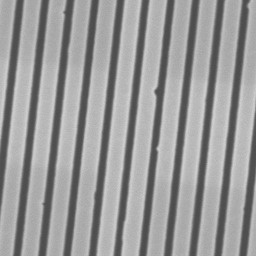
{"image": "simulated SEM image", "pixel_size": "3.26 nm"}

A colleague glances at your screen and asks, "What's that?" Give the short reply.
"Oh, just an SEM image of parallel lines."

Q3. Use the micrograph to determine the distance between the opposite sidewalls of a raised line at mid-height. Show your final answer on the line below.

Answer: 57.5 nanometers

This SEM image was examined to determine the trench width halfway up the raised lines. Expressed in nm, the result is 23.1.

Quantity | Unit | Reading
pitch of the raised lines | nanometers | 81.3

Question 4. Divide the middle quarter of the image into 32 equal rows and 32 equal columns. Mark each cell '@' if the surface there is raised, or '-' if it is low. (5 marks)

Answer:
-@@@@--@@@@--@@@@@--@@@@--@@@@--
-@@@@--@@@@--@@@@--@@@@@--@@@@--
@@@@@--@@@@--@@@@--@@@@@--@@@@--
@@@@@--@@@@--@@@@--@@@@---@@@@--
@@@@@--@@@@--@@@@--@@@@@--@@@@--
@@@@---@@@@--@@@@--@@@@--@@@@@--
@@@@--@@@@@--@@@@--@@@@--@@@@---
@@@@--@@@@@--@@@@--@@@@--@@@@--@
@@@@--@@@@--@@@@@--@@@@--@@@@--@
@@@@--@@@@--@@@@@--@@@@--@@@@--@
@@@@--@@@@--@@@@--@@@@@--@@@@--@
@@@@--@@@@--@@@@--@@@@@--@@@@--@
@@@@--@@@@--@@@@--@@@@@-@@@@@--@
@@@--@@@@@--@@@@--@@@@@--@@@@--@
@@@---@@@@--@@@@--@@@@--@@@@@--@
@@@--@@@@@--@@@@--@@@@--@@@@@--@
@@@--@@@@@--@@@@--@@@@--@@@@--@@
@@@--@@@@--@@@@@--@@@@--@@@@--@@
@@@--@@@@--@@@@@--@@@@--@@@@--@@
@@@--@@@@--@@@@--@@@@@--@@@@--@@
@@@--@@@@--@@@@--@@@@@--@@@@--@@
@@@--@@@@--@@@@--@@@@@-@@@@@--@@
@@--@@@@@--@@@@--@@@@@--@@@@--@@
@@--@@@@@--@@@@--@@@@--@@@@@--@@
@@--@@@@@--@@@@--@@@@--@@@@@--@@
@@--@@@@@--@@@@--@@@@--@@@@--@@@
@@--@@@@--@@@@@--@@@@--@@@@--@@@
@@--@@@@--@@@@@--@@@@--@@@@--@@@
@@--@@@@--@@@@--@@@@@--@@@@--@@@
@@--@@@@--@@@@--@@@@@--@@@@--@@@
@@--@@@@--@@@@--@@@@@--@@@@--@@@
@@-@@@@@--@@@@--@@@@@--@@@@--@@@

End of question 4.